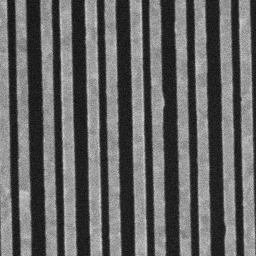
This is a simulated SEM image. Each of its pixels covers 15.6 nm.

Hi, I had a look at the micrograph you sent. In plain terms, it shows parallel lines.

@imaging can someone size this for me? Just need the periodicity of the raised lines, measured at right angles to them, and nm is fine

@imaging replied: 347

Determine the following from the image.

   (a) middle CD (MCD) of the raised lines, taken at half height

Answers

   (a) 160 nm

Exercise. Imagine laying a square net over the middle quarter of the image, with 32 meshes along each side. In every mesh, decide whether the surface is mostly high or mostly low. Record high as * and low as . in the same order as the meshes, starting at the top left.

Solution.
**....**...**....**...**....***.
**....**...**....**...**....***.
**....**...**....***..**....***.
**....**...**....***..**....***.
**....**...**....***..**....***.
**....**...**....***..**....***.
**....**...**....***..**....***.
**....***..**....***..**....***.
**....***..**....***..***...***.
**....***..**....***..***...***.
**....***..**....***..***...***.
**....***..**....***..***....**.
**....***..**....***..**.....**.
**....***..**....***..***....**.
**....***..**....***..***....**.
**....***..**....***..***....**.
**....***..**....***..***....**.
**....***..**....***..***....**.
**....***..**....***..***....**.
**....***..**....***..***....**.
**....***..**....***..***....**.
**....***..**.....**..***....**.
**....***..**.....**..***....**.
**....***..**.....**..***....**.
**....***..***....**..***....**.
**....***..***....**..***....**.
**....***..***....**..***....**.
**....***..***....**..***....**.
**....***..***....**...**....**.
***...***..***....**...**....**.
***...***..***....**...**....**.
***...***..***....**...**....**.